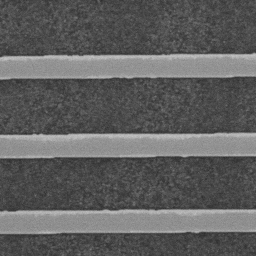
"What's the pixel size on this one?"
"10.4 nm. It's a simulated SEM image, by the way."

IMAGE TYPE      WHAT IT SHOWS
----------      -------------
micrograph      lines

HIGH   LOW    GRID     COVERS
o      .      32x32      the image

................................
................................
................................
................................
................................
................................
................................
oooooooooooooooooooooooooooooooo
oooooooooooooooooooooooooooooooo
oooooooooooooooooooooooooooooo..
................................
................................
................................
................................
................................
................................
................................
oooooooooooooooooooooooooooooooo
oooooooooooooooooooooooooooooooo
oooooooooooooooooooo..oo........
................................
................................
................................
................................
................................
................................
........oooooooooooooooooooooooo
oooooooooooooooooooooooooooooooo
oooooooooooooooooooooooooooooooo
................................
................................
................................